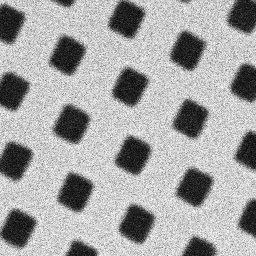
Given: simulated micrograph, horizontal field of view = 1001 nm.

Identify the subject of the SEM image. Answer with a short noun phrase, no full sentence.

a regular array of holes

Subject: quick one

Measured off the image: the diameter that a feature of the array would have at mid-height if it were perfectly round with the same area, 36.1 px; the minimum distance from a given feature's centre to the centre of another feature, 0.266 um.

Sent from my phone